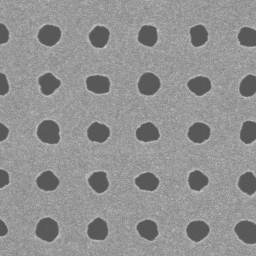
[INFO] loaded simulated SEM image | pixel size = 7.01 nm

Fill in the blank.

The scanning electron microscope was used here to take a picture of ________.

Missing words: a regular array of holes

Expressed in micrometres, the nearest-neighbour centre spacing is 0.339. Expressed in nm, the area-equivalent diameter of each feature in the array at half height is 149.